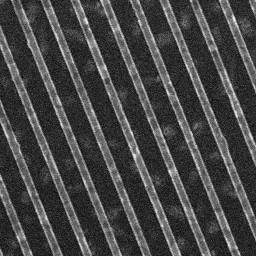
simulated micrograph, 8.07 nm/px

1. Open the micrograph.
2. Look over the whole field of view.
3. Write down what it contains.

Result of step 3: parallel lines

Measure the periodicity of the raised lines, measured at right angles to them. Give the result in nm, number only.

222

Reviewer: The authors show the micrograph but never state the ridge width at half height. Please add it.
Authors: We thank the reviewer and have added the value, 57.1 nm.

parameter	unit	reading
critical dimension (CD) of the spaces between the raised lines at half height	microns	0.165